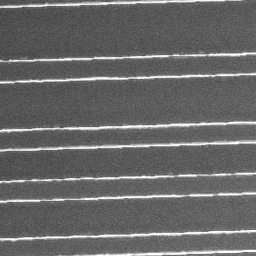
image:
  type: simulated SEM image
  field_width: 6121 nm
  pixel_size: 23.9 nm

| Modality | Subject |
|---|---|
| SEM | lines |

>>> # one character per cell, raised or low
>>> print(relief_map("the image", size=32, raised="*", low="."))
************....................
................................
................................
................................
................................
................................
................................
......**************************
********************************
*************************.......
................................
................................
................................
................................
................................
..........................******
********************************
********************************
***********.....................
................................
................................
................................
........************************
********************************
********************............
................................
................................
................................
................................
............********************
********************************
**************************......